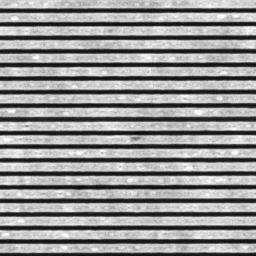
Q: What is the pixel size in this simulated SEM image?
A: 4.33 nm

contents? parallel lines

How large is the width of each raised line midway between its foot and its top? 9.63 pixels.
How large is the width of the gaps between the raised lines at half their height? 3.88 px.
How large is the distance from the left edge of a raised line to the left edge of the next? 13.6 px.